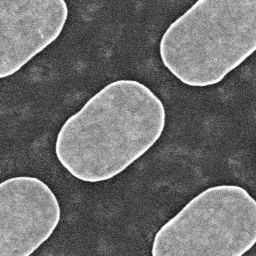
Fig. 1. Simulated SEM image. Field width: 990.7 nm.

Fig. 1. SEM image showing raised bodies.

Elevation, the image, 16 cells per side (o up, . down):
oooo........oooo
oooo.......ooooo
ooo.......oooooo
oo........ooooo.
o..........ooo..
.......oo.......
.....ooooo......
....oooooo......
....oooooo......
....ooooo.......
....oooo........
ooo.............
ooo.........oooo
oooo.......ooooo
ooo.......oooooo
oo........oooooo